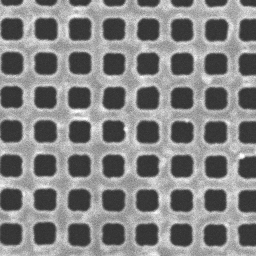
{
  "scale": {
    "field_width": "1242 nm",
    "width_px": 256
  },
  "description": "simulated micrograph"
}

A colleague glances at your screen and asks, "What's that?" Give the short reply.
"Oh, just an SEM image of a regular array of holes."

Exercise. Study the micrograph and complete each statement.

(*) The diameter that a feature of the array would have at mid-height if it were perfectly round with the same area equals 118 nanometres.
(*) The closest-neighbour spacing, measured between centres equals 163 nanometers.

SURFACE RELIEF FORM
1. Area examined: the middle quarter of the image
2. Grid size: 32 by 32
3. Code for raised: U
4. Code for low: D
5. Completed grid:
UDDDDDDUUUDDDDDUUUDDDDDDUUUDDDDD
UUDDDDDUUUDDDDDUUUDDDDDDUUUDDDDD
UUDDDDUUUUDDDDUUUUUDDDDUUUUDDDDD
UUUUUUUUUUUUUUUUUUUUUUUUUUUUUUUU
UUUUUUUUUUUUUUUUUUUUUUUUUUUUUUUU
UUDUUUUUUUUUUUUUUUUUUUUUUUUUUUUU
UDDDDDDUUUDDDDDUUUDDDDDUUUUDDDDD
UDDDDDDUUUDDDDDUUUDDDDDDUUUDDDDD
UDDDDDDUUUDDDDDUUUDDDDDDUUUDDDDD
UDDDDDDUUUDDDDDUUUDDDDDDUUUDDDDD
UDDDDDDUUUDDDDDUUUDDDDDDUUUDDDDD
UUUUUUUUUUUUUUUUUUUUUUUUUUUUUUUU
UUUUUUUUUUUUUUUUUUUUUUUUUUUUUUUU
UUUUUUUUUUUUUUUUUUUUUUUUUUUUUUUU
UUDDDDUUUUDDDDDUUUUDDDDUUUUDDDDD
UDDDDDDUUUDDDDDUUUDDDDDDUUUDDDDD
UDDDDDDUUUDDDDDUUUDDDDDDUUUDDDDD
UDDDDDDUUUDDDDDUUUDDDDDDUUUDDDDD
UDDDDDDUUUDDDDDUUUDDDDDDUUUDDDDD
UUDDDDUUUUDDDDUUUUUDDDDUUUUDDDDD
UUUUUUUUUUUUUUUUUUUUUUUUUUUUUUUU
UUUUUUUUUUUUUUUUUUUUUUUUUUUUUUUU
UUUUUUUUUUUUUUUUUUUUUUUUUUUUUUUU
UDDDDDUUUUDDDDDUUUDDDDDDUUUDDDDD
UDDDDDDUUUDDDDDUUUDDDDDDUUUDDDDD
UDDDDDDUUUDDDDDUUUDDDDDDUUUDDDDD
UDDDDDDUUUDDDDDUUUDDDDDDUUDDDDDD
UDDDDDUUUUDDDDDUUUDDDDDDUUUDDDDD
UUUUUUUUUUUUUUUUUUUUUUUUUUUUDDDU
UUUUUUUUUUUUUUUUUUUUUUUUUUUUUUUU
UUUUUUUUUUUUUUUUUUUUUUUUUUUUUUUU
UUDDDDUUUUDDDDDUUUUDDDUUUUUUDDDU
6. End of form